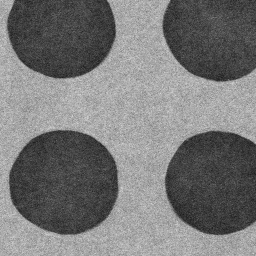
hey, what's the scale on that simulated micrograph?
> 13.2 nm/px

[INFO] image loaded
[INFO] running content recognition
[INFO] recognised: holes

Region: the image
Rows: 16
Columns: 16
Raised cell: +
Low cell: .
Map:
+......+++......
.......+++......
+......+++......
+......++++.....
++....++++++....
++++++++++++++++
++++++++++++++++
++++++++++++++++
++....++++++...+
+......++++.....
+......+++......
+......+++......
+......++++.....
+......++++.....
+++..++++++++..+
++++++++++++++++